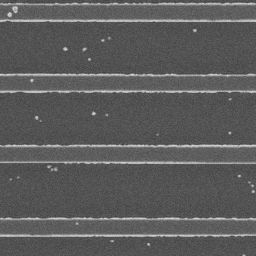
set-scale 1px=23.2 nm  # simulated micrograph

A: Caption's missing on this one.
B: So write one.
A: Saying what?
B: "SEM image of lines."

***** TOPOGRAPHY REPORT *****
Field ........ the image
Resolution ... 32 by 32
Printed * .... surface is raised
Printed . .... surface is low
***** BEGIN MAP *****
*.*.....***.*.**.**.***.*.**.***
********************************
********************************
................................
................................
................................
................................
................................
................................
********************************
********************************
.*.***...............*..*......*
................................
................................
................................
................................
................................
................................
********************************
********************************
................................
................................
................................
................................
................................
................................
................................
********************************
********************************
********************..***.*.....
................................
................................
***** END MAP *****